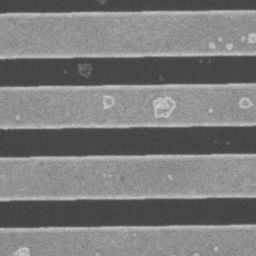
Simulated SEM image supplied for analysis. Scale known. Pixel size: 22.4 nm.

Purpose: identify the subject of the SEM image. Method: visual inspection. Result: lines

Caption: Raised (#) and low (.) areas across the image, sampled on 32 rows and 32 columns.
................................
................................
################################
################################
################################
################################
################################
................................
................................
................................
................................
################################
################################
################################
################################
########################........
................................
................................
................................
................................
################################
################################
################################
################################
##########################......
................................
................................
................................
...................#############
################################
################################
################################